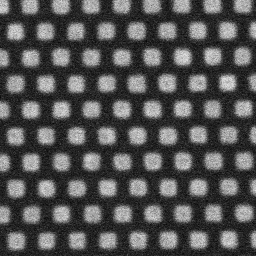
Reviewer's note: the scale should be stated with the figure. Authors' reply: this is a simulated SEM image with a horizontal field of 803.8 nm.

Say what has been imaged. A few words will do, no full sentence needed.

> a regular array of raised bodies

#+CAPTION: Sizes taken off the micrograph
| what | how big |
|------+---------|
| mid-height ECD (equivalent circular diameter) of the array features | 53.8 nm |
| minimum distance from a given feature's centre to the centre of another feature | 94 nm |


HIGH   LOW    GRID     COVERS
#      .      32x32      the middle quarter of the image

................................
................................
................................
.####....###....####....####....
.####....####...####....####....
.####....####...####....####...#
.####....###....####....###.....
................................
................................
.............##.................
#....####...####....####....####
#....####...####....####....####
#....####....###....####....####
................................
................................
................................
.####....###.....###....####....
.####....####...####....####....
.####....####...####....####....
..###....###.....###....####....
................................
................................
......##....................#...
#....####...####....####....###.
#....####...####....####....####
#....####....###....####....####
................................
................................
................................
..###....####....###....####....
.####....####....###....####....
.####....####....###....####....